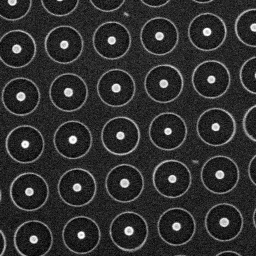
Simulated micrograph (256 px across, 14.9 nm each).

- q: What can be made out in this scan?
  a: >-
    an array of small figures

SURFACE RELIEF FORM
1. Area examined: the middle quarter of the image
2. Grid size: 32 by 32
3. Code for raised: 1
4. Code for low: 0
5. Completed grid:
11111111111111111111111100111111
11111111111110111111110000001111
01111111110000001111100000000111
00001111100000000111000000000111
00000111100000000111000011000011
00000111000011000011000011000011
11000011000011000011100000000111
11000011100000000111100000000111
00000111100000000111110000001111
00000111110000001111111110111111
00001111111100111111111111111111
00011111111111111111111111111111
11111111111111111111111110011111
11111111111110011111111000000111
10011111111000000111110000000011
00000111110000000011110000000011
00000011110000000011100001100001
00000011110001100001100000000011
00100001100000100001110000000011
00000001110000000001110000000011
00000001110000000011111000001111
00000011111000000111111111111111
00000111111110011111111111111111
10011111111111111111111111111111
11111111111111111111111110000111
11111111111111000111111100000011
11000111111100000011111000000001
00000011111000000001111000000001
00000001111000000000110000110000
00000000110000110000111000010000
00010000111000010000111000000001
00010000111000000001111000000001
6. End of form